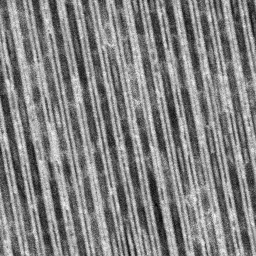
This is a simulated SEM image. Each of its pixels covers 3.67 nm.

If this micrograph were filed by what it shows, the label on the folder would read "parallel lines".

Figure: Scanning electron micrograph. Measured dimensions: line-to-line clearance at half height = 37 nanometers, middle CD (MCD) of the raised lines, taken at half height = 23.4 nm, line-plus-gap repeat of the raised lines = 59.6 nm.